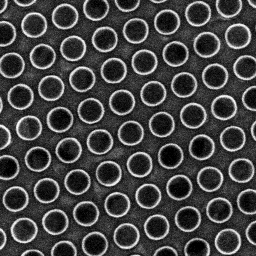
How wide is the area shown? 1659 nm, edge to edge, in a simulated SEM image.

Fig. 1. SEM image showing a regular array of raised bodies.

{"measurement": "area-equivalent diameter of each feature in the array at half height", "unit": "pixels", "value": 24.1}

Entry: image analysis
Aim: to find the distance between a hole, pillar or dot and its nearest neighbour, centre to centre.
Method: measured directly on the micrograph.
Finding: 208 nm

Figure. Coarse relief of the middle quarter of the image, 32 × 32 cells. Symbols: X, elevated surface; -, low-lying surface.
----------XXXXX--XXXXXX---------
---XXX---XXXXXX---XXXX----------
--XXXXX---XXXXX--------------XX-
--XXXXXX--XXXXX-------------XXXX
--XXXXX----XX---------X----XXXXX
--XXXXX-------------XXXXX--XXXXX
---XX---------------XXXXX--XXXXX
------------XXXXX--XXXXXX---XXXX
------------XXXXX--XXXXXX-------
-----XXXX---XXXXX---XXXX--------
----XXXXX---XXXXX--------------X
X---XXXXXX--XXXXX-------------XX
XX--XXXXXX----X--------XXX---XXX
XX--XXXXX-------------XXXXX--XXX
XX----XX--------XX---XXXXXX---XX
X-------------XXXXX---XXXXX----X
--------------XXXXXX--XXXXX-----
-------XXXX---XXXXXX---XXX------
------XXXXXX--XXXXXX------------
XXX---XXXXXX---XXXX-------------
XXXX--XXXXXX-------------XXX---X
XXXX---XXXX-------------XXXXX---
XXXX--------------XX----XXXXXX--
XXX-------------XXXXX---XXXXXX--
XX---------X----XXXXXX--XXXXX---
---------XXXX---XXXXXX---XXX----
--------XXXXXX--XXXXXX----------
-XXXXX--XXXXXX---XXXX-----------
-XXXXX--XXXXXX-------------XXXX-
XXXXXX---XXXX-------------XXXXX-
XXXXXX--------------XXX---XXXXXX
-XXXX-------------XXXXXX--XXXXXX